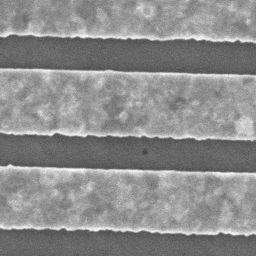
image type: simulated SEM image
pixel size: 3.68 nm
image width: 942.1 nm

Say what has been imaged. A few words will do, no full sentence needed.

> one or a few lines or trenches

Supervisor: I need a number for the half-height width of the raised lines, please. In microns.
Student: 0.232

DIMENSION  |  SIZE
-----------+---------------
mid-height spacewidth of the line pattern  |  124 nm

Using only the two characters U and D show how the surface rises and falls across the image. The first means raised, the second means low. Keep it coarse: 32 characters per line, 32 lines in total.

UUUUUUUUUUUUUUUUUUUUUUUUUUUUUUUU
UUUUUUUUUUUUUUUUUUUUUUUUUUUUUUUU
UUUUUUUUUUUUUUUUUUUUUUUUUUUUUUUU
UUUUUUUUUUUUUUUUUUUUUUUUUUUUUUUU
UDDDUUDUUUUUUUUUUUUUUUUUUUUUUUUU
DDDDDDDDDDDDDDDDDDDDDDDDDDDDDDDD
DDDDDDDDDDDDDDDDDDDDDDDDDDDDDDDD
DDDDDDDDDDDDDDDDDDDDDDDDDDDDDDDD
DDDDDDDDDDDDDDDDDDDDDDDDDDDDDDDD
UUUUUUUUUUUUUUUUUUUUUUUUUUUUUUUU
UUUUUUUUUUUUUUUUUUUUUUUUUUUUUUUU
UUUUUUUUUUUUUUUUUUUUUUUUUUUUUUUU
UUUUUUUUUUUUUUUUUUUUUUUUUUUUUUUU
UUUUUUUUUUUUUUUUUUUUUUUUUUUUUUUU
UUUUUUUUUUUUUUUUUUUUUUUUUUUUUUUU
UUUUUUUUUUUUUUUUUUUUUUUUUUUUUUUU
UUUUUUUUUUUUUUUUUUUUUUUUUUUUUUUU
DDDDDDDDDDDDDDDDDDDDDDDDDDDDDDDD
DDDDDDDDDDDDDDDDDDDDDDDDDDDDDDDD
DDDDDDDDDDDDDDDDDDDDDDDDDDDDDDDD
DDDDDDDDDDDDDDDDDDDDDDDDDDDDDDDD
UUUUUUUUUUUUUUUUUUUUUUUDDDDDDDDD
UUUUUUUUUUUUUUUUUUUUUUUUUUUUUUUU
UUUUUUUUUUUUUUUUUUUUUUUUUUUUUUUU
UUUUUUUUUUUUUUUUUUUUUUUUUUUUUUUU
UUUUUUUUUUUUUUUUUUUUUUUUUUUUUUUU
UUUUUUUUUUUUUUUUUUUUUUUUUUUUUUUU
UUUUUUUUUUUUUUUUUUUUUUUUUUUUUUUU
UUUDUUUUUUUUUUUUUUUUUUUUUUUUUUUU
DDDDDDDDDDDDDDDDDDDDDDDDDDDDDDDD
DDDDDDDDDDDDDDDDDDDDDDDDDDDDDDDD
DDDDDDDDDDDDDDDDDDDDDDDDDDDDDDDD